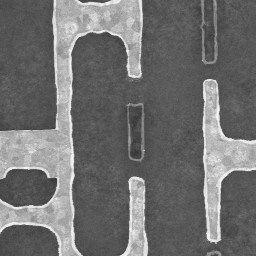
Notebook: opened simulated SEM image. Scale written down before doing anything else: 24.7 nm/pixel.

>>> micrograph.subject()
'one or a few lines or trenches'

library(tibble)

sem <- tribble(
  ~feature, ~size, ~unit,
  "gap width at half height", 1480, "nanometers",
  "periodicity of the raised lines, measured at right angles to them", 1.83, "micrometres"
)